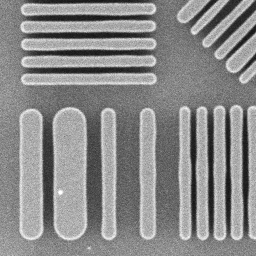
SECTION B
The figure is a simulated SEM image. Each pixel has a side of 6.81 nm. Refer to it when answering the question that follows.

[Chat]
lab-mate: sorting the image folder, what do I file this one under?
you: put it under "groups of lines, slits or small figures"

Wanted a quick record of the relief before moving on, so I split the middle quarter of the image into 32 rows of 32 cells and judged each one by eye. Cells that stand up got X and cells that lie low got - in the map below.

XXXXXXXXXXXXXXXXX---------------
--------------------------------
--------------------------------
XXXXXXXXXXXXXXXXXXXXXXX---------
XXXXXXXXXXXXXXXXXXXXXXX---------
--------------------------------
--------------------------------
--------------------------------
--------------------------------
--------------------------------
--------------------------------
XXX-------XX--------XX-------XX-
XXXXX----XXXX------XXX-------XX-
XXXXX----XXXX------XXXX------XX-
XXXXX----XXXX------XXXX------XX-
XXXXX----XXXX------XXXX------XX-
XXXXX----XXXX------XXXX------XX-
XXXXXX---XXXX------XXXX------XX-
XXXXXX---XXXX------XXXX------XX-
XXXXXX---XXXX------XXXX------XX-
XXXXXX---XXXX------XXXX------XX-
XXXXX----XXXX------XXX-------XX-
XXXXX-----XXX------XXX-------XX-
XXXXX-----XXX------XXXX------XX-
XXXXX-----XXX------XXXX------XXX
XXXXX-----XXX------XXXX------XXX
XXXXX-----XXX------XXXX------XXX
XXXXX-----XXX------XXXX------XXX
XXXXX-----XXX------XXXX------XXX
XXXXX-----XXX------XXXX------XXX
XXXXX-----XXX------XXXX------XXX
XXXXX-----XXX------XXXX------XXX